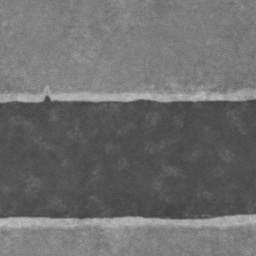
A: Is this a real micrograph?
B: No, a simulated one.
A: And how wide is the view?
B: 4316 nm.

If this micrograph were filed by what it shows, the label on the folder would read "one or a few lines or trenches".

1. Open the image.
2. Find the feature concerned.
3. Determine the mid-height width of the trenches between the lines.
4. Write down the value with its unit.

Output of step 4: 2090 nm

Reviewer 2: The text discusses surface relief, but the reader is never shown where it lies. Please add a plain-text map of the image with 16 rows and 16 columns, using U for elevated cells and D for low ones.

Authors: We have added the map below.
UUUUUUUUUUUUUUUU
UUUUUUUUUUUUUUUU
UUUUUUUUUUUUUUUU
UUUUUUUUUUUUUUUU
UUUUUUUUUUUUUUUU
UUUUUUUUUUUUUUUU
DDDDDDDDDDDDDDDD
DDDDDDDDDDDDDDDD
DDDDDDDDDDDDDDDD
DDDDDDDDDDDDDDDD
DDDDDDDDDDDDDDDD
DDDDDDDDDDDDDDDD
DDDDDDDDDDDDDDDD
DDDDDDDDDDDDDDDD
UUUUUUUUUUUUUUUU
UUUUUUUUUUUUUUUU